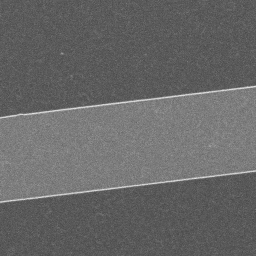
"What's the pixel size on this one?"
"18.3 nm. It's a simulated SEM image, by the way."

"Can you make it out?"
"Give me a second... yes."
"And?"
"one or a few lines or trenches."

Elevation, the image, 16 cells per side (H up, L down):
HHHHHHHHHHHHHHHH
HHHHHHHHHHHHHHHH
HHHHHHHHHHHHHHHH
HHHHHHHHHHHHHHHH
HHHHHHHHHHHHHHHH
HHHHHHHHHHHHHHHL
HHHHHHHLLLLLLLLL
LLLLLLLLLLLLLLLL
LLLLLLLLLLLLLLLL
LLLLLLLLLLLLLLLL
LLLLLLLLLLLLLLLL
LLLLLLLLLHHHHHHH
LHHHHHHHHHHHHHHH
HHHHHHHHHHHHHHHH
HHHHHHHHHHHHHHHH
HHHHHHHHHHHHHHHH